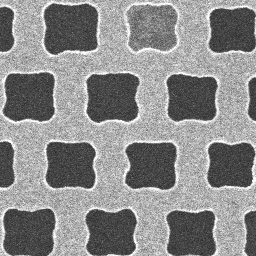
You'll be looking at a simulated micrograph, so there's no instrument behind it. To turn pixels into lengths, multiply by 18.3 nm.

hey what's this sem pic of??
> a regular array of holes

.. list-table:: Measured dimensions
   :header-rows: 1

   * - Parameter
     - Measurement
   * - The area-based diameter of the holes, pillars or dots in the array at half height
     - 0.961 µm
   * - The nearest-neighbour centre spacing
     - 1450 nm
